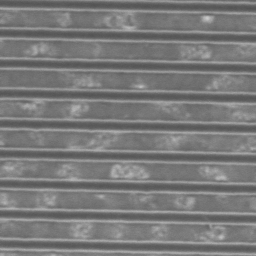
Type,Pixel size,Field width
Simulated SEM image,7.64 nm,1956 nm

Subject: parallel lines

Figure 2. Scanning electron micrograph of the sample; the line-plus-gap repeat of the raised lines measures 230 nm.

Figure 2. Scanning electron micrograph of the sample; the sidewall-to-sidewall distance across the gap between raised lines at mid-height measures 141 nanometres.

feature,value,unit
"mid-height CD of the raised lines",86.9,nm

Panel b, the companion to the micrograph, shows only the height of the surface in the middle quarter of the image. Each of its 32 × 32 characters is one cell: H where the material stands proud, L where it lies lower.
HHHHHHHHHHHHHHHHHHHHHHHHHHHHHHHH
LLHHHHHHHHHHHHHHHHHHHHHHHHHHHHHH
LLLLLLLLLLLLLLLLLLLLLLLLLLLLLLLL
LLLLLLLLLLLLLLLLLLLLLLLLLLLLLLLL
LLLLLLLLLLLLLLLLLLLLLLLLLLLLLLLL
LLLLLLLLLLLLLLLLLLLLLLLLLLLLLLLL
HLHHHHHHHHLLLLLLLLLLLLLLLLLLLLLL
HHHHHHHHHHHHHHHHHHHHHHHHHHHHHHHH
HHHHHHHHHHHHHHHHHHHHHHHHHHHHHHHH
LLLLLLLLLLLLLLLLLLLLLLLLLLLLHHHH
LLLLLLLLLLLLLLLLLLLLLLLLLLLLLLLL
LLLLLLLLLLLLLLLLLLLLLLLLLLLLLLLL
LLLLLLLLLLLLLLLLLLLLLLLLLLLLLLLL
LLLLLLLLLLLLLLLLLLLLLLLLLLLLLLLL
HHHHHHHHHHHHHHHHHHHHHHHHHLLLLLLL
HHHHHHHHHHHHHHHHHHHHHHHHHHHHHHHH
HHHHHHHHHHHHHHHHHHHHHHHHHHHHHHHH
LLLLLLLLLLLLLLLLLLLLLLLLLLLLLLLL
LLLLLLLLLLLLLLLLLLLLLLLLLLLLLLLL
LLLLLLLLLLLLLLLLLLLLLLLLLLLLLLLL
LLLLLLLLLLLLLLLLLLLLLLLLLLLLLLLL
HLLLLLLLLLLLLLLLLLLLLLLLLLLLLLLL
HHHHHHHHHHHHHHHHHHHHHHHHHHHHHHHH
HHHHHHHHHHHHHHHHHHHHHHHHHHHHHHHH
LLLLLLLLLLLLLLLLLLLLHHHLHHHHHHHH
LLLLLLLLLLLLLLLLLLLLLLLLLLLLLLLL
LLLLLLLLLLLLLLLLLLLLLLLLLLLLLLLL
LLLLLLLLLLLLLLLLLLLLLLLLLLLLLLLL
LLLLLLLLLLLLLLLLLLLLLLLLLLLLLLLL
HHHHHHHHHHHHHHHHHHHHHHHHHHLLLLLL
HHHHHHHHHHHHHHHHHHHHHHHHHHHHHHHH
HHHHHHHHHHHHHHHHHHHHHHHHHHHHHHHH